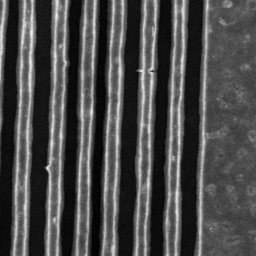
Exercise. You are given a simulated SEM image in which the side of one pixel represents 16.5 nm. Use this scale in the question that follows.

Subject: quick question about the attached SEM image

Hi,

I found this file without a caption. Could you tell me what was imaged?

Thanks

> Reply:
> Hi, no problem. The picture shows parallel lines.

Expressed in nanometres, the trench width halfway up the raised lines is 298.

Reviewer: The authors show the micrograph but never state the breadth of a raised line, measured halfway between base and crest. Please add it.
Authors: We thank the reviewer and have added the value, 209 nm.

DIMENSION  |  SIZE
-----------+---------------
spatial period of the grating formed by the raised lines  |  501 nanometres